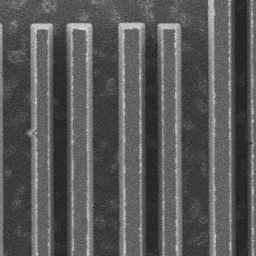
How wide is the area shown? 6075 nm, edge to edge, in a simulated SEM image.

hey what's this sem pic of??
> parallel lines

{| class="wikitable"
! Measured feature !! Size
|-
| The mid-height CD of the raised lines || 460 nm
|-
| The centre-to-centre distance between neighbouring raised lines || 45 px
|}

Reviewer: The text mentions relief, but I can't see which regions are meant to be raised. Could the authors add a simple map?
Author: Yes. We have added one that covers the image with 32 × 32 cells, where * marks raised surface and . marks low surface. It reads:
..........................***..*
..........................***..*
..........................***..*
.....*...**....***..**....***..*
....**...**....***..**....***..*
....**...**....***..**....***..*
....**...**....***..**....***..*
....**...**....***..**....***..*
....**...**....***..**....***..*
....**...**....***..**....***..*
....**...**....***..**....***..*
....**...**....***..**....***..*
....**...**....***..**.....**..*
....**...**....***..**.....**..*
....**...**....***..**.....**..*
....**...**....***..**.....**..*
....**...**....***..**.....**..*
....**...**....***..**.....**..*
....**...**....***..**.....**..*
....**...**....***..**.....**..*
....**...**....***..**.....**..*
....**...**....***..**.....**..*
....**...**....***..**.....**..*
....**...**....***..**.....**..*
....**...**....***..**.....**..*
....**...**....***..**.....**..*
....**...**....***..**.....**..*
....**...**....***..**.....**..*
....**...**....***..**.....**..*
....**...**....***..**.....**..*
....**...**....***..**.....**..*
....**...**....***..**.....**..*